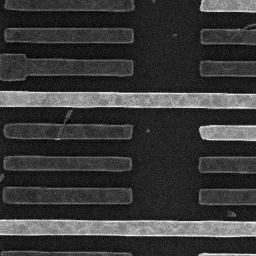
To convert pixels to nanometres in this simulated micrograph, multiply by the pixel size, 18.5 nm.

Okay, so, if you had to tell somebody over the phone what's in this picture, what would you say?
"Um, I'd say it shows wiring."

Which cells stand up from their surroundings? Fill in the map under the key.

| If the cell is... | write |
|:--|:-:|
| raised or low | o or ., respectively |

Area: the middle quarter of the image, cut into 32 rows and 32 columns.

ooooooooooooooooo...............
ooooooooooooooooo...............
ooooooooooooooooo...............
................................
................................
................................
................................
oooooooooooooooooooooooooooooooo
oooooooooooooooooooooooooooooooo
oooooooooooooooooooooooooooooooo
oooooooooooooooooooooooooooooooo
................................
................................
................................
................................
oooooooooooo...oo...............
ooooooooooooooooo...............
ooooooooooooooooo...............
oooooooooooooooo................
................................
................................
................................
................................
ooooooooooooooo.................
ooooooooooooooooo...............
ooooooooooooooooo...............
..........oooooo................
................................
................................
................................
................................
ooooooooooooooooo...............